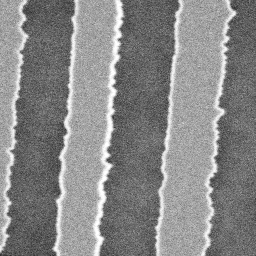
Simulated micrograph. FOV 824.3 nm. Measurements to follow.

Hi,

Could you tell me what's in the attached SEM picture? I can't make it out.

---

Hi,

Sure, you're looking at lines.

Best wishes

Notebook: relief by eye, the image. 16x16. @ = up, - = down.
@----@@@---@@@--
@----@@@---@@@--
@@---@@----@@@--
@---@@@----@@@--
@---@@@----@@@--
@---@@@----@@@--
@---@@@----@@@--
@---@@@----@@@--
@---@@@---@@@@--
@---@@@---@@@@--
@---@@@---@@@---
@---@@----@@@---
----@@----@@@---
@---@@----@@@---
----@@----@@@---
---@@@----@@@---